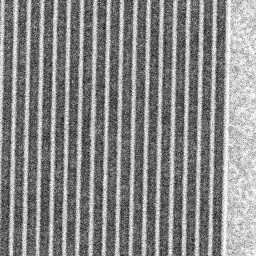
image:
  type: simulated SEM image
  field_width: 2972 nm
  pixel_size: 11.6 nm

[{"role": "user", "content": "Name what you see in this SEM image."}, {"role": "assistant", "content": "parallel lines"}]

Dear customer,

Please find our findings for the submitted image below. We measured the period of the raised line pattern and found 0.154 micrometres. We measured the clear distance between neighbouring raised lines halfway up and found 112 nanometers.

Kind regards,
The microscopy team